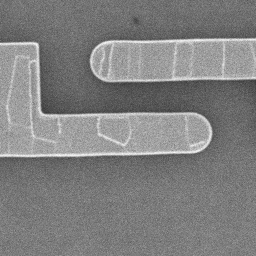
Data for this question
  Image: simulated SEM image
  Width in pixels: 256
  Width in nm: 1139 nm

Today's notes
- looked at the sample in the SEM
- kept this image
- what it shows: groups of lines, slits or small figures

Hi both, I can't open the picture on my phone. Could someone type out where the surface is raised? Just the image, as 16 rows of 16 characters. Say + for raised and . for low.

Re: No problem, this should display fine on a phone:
................
................
............++++
++....++++++++++
++....++++++++++
++..............
++..............
+++++++++++++...
+++++++++++++...
++++++++++++....
................
................
................
................
................
................